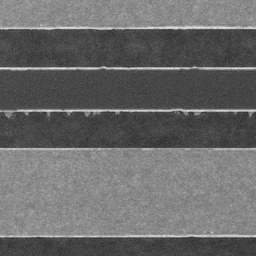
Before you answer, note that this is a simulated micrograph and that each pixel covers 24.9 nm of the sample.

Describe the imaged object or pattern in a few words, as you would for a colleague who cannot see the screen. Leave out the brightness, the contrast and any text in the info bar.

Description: lines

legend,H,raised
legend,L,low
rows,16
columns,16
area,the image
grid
HHHHHHHHHHHHHHHH
HHHHHHHHHHHHHHHH
LLLLLLLLLLLLLLLL
LLLLLLLLLLLLLLLL
HHHHHHHHHHHHHHHH
HHHHHHHHHHHHHHHH
HHHHHHHHHHHHHHHH
LLLLLLLLLLLLLLLL
LLLLLLLLLLLLLLLL
HHHHHHHHHHHHHHHH
HHHHHHHHHHHHHHHH
HHHHHHHHHHHHHHHH
HHHHHHHHHHHHHHHH
HHHHHHHHHHHHHHHH
HHHHHHHHHHHHHHHH
LLLLLLLLLLLLLLLL